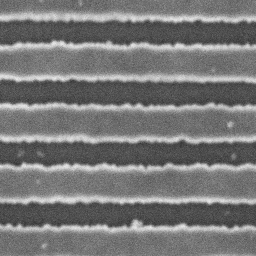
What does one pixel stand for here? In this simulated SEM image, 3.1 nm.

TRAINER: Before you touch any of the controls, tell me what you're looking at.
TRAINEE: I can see lines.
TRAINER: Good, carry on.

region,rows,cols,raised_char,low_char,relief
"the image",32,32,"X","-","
XXXXXXXXXXXXXXXXXXXXXXXXXXXXXXXX
XXXXXXXXXXXXXXXXXXXXXXXXXXXXXXXX
----------------XX--XXXX-XXXXX-X
--------------------------------
--------------------------------
--XXXXXXX-XXX---XXX-------------
XXXXXXXXXXXXXXXXXXXXXXXXXXXXXXXX
XXXXXXXXXXXXXXXXXXXXXXXXXXXXXXXX
XXXXXXXXXXXXXXXXXXXXXXXXXXXXXXXX
XXXXXXXXXXXXXXXXXXXXXXXXXXXXXXXX
--------------------------------
--------------------------------
--------------------------------
XXXXXXXXXXXXXXXXXXXXXXXXXXXXXXXX
XXXXXXXXXXXXXXXXXXXXXXXXXXXXXXXX
XXXXXXXXXXXXXXXXXXXXXXXXXXXXXXXX
XXXXXXXXXXXXXXXXXXXXXXXXXXXXXXXX
XXXXXXXXXXXXXXXXXXXXXXXXXXXXXXXX
--------------------------------
--------------------------------
------------------------X-------
XXXXXXXXXXXXXXXXXXXXXXXXXXXXXXXX
XXXXXXXXXXXXXXXXXXXXXXXXXXXXXXXX
XXXXXXXXXXXXXXXXXXXXXXXXXXXXXXXX
XXXXXXXXXXXXXXXXXXXXXXXXXXXXXXXX
--------------------------------
--------------------------------
--------------------------------
XXXXXXXXXXXXXXXXXXXXXXXXXXXXXXXX
XXXXXXXXXXXXXXXXXXXXXXXXXXXXXXXX
XXXXXXXXXXXXXXXXXXXXXXXXXXXXXXXX
XXXXXXXXXXXXXXXXXXXXXXXXXXXXXXXX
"